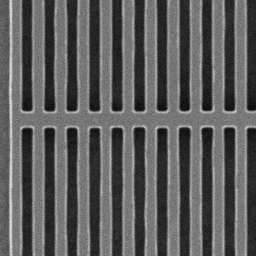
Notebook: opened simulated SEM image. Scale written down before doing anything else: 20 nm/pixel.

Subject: groups of lines, slits or small figures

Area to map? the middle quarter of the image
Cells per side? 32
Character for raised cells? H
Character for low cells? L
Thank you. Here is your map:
HLLHHHLLLHHHLLLHHLLLLHHLLLHHHLLL
HLLHHHLLLHHHLLLHHLLLLHHLLLHHHLLL
HLLHHHLLLHHHLLLHHLLLLHHLLLHHHLLL
HLLHHHLLLHHHLLLHHLLLLHHLLLHHHLLL
HLLLHHLLLHHHLLLHHLLLLHHLLLHHHLLL
LLLLHHLLLHHHLLLHHLLLLHHLLLHHHLLL
LLLLHHLLLHHHLLLHHLLLLHHLLLHHHLLL
LLLLHHLLLHHHLLLHHLLLLHHLLLHHHLLL
LLLLHHLLLHHHLLLHHLLLLHHLLLHHHLLL
LLLLHHLLLHHHLLLHHLLLLHHLLLHHHLLL
LLLLHHLLLHHHLLLHHLLLLHHLLLHHHLLL
HLLHHHLLLHHHLLLHHHLLHHHLLLHHHLLH
HHHHHHHHHHHHHHHHHHHHHHHHHHHHHHHH
HHHHHHHHHHHHHHHHHHHHHHHHHHHHHHHH
HHHHHHHHHHHHHHHHHHHHHHHHHHHHHHHH
HHHHHHHHHHHHHHHHHHHHHHHHHHHHHHHH
HLLHHHLLLHHHLLLHHLLLLHHLLLHHLLLL
LLLLHHLLLHHHLLLHHLLLLHHLLLHHLLLL
LLLLHHLLLHHHLLLHHLLLLHHLLLHHLLLL
LLLLHHLLLHHHLLLHHLLLLHHLLLHHLLLL
LLLLHHLLLHHHLLLHHLLLLHHLLLHHLLLL
LLLLHHLLLHHHLLLHHLLLLHHLLLHHLLLL
HLLLHHLLLHHHLLLHHLLLLHHLLLHHLLLL
HLLLHHLLLHHHLLLHHLLLLHHLLLHHLLLL
HLLLHHLLLHHHLLLHHLLLLHHLLLHHLLLL
HLLHHHLLLHHHLLLHHLLLLHHLLLHHHLLL
HLLHHHLLLHHHLLLHHLLLLHHLLLHHHLLL
HLLHHHLLLHHHLLLHHLLLLHHLLLHHHLLL
HLLHHHLLLHHHLLLHHLLLLHHLLLHHHLLL
HLLHHHLLLHHHLLLHHLLLLHHLLLHHHLLL
HLLLHHLLLHHHLLLHHLLLLHHLLLHHHLLL
HLLLHHLLLHHHLLLHHLLLLHHLLLHHHLLL